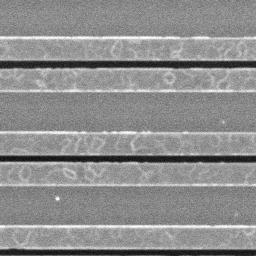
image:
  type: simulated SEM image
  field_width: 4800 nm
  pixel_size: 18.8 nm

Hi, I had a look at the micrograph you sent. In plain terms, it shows lines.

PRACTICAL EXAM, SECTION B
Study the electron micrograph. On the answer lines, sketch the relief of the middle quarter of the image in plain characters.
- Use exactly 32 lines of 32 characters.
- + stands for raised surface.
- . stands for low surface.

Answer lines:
................................
++++++++++++++++++++++++++++++++
++++++++++++++++++++++++++++++++
++++++++++++++++++++++++++++++++
++++++++++++++++++++++++++++++++
++++++++++++++++++++++++++++++++
++++++++++++++++++++++++++++++++
................................
................................
................................
................................
................................
................................
................................
................................
................................
................................
++++++++++++++++++++++++++++++++
++++++++++++++++++++++++++++++++
++++++++++++++++++++++++++++++++
++++++++++++++++++++++++++++++++
++++++++++++++++++++++++++++++++
++++++++++++++++++++++++++++++++
................................
................................
++++++++++++++++++++++++++++++++
++++++++++++++++++++++++++++++++
++++++++++++++++++++++++++++++++
++++++++++++++++++++++++++++++++
++++++++++++++++++++++++++++++++
................................
................................